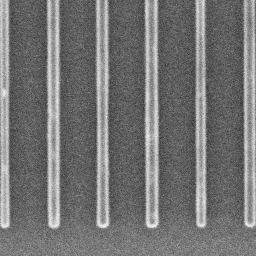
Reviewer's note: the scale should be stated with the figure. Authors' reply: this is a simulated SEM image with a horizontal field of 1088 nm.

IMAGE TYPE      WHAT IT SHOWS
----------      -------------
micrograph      parallel lines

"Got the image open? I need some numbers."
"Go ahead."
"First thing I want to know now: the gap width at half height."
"165 nanometres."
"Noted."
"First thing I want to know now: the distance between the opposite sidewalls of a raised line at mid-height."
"0.0404 um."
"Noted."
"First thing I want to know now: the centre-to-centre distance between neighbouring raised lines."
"209 nm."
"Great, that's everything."